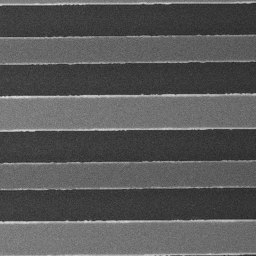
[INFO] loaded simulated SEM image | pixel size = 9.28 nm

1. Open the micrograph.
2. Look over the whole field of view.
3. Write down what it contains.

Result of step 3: lines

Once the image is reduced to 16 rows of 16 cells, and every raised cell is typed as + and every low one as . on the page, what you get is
................
................
++++++++++++++++
++++++++++++++++
................
................
++++++++++++++++
++++++++++++++++
................
................
++++++++++++++++
++++++++++++++++
................
................
++++++++++++++++
++++++++++++++++